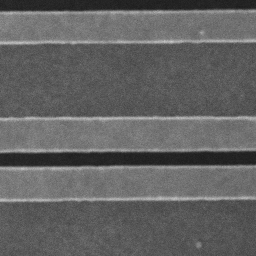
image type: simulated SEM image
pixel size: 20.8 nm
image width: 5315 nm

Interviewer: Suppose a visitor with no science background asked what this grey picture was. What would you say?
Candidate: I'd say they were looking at lines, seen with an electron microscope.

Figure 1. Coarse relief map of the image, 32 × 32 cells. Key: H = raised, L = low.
LLLLLLLLLLLLLLLLLLLLLLLLLLLLLLLL
HHHHHHHHHHHHHHHHHHHHHHHHHHHHHHHH
HHHHHHHHHHHHHHHHHHHHHHHHHHHHHHHH
HHHHHHHHHHHHHHHHHHHHHHHHHHHHHHHH
HHHHHHHHHHHHHHHHHHHHHHHHHHHHHHHH
LLLLLLLLLLLLLLLLLLLLLLLLLLLLLLLL
LLLLLLLLLLLLLLLLLLLLLLLLLLLLLLLL
LLLLLLLLLLLLLLLLLLLLLLLLLLLLLLLL
LLLLLLLLLLLLLLLLLLLLLLLLLLLLLLLL
LLLLLLLLLLLLLLLLLLLLLLLLLLLLLLLL
LLLLLLLLLLLLLLLLLLLLLLLLLLLLLLLL
LLLLLLLLLLLLLLLLLLLLLLLLLLLLLLLL
LLLLLLLLLLLLLLLLLLLLLLLLLLLLLLLL
LLLLLLLLLLLLLLLLLLLLLLLLLLLLLLLL
LLLLLLLLLLLLLLLLLLLLLLLLLLLLLLLL
HHHHHHHHHHHHHHHHHHHHHHHHHHHHHHHH
HHHHHHHHHHHHHHHHHHHHHHHHHHHHHHHH
HHHHHHHHHHHHHHHHHHHHHHHHHHHHHHHH
HHHHHHHHHHHHHHHHHHHHHHHHHHHHHHHH
LLLLLLLLLLLLLLLLLLLLLLLLLLLLLLLL
LLLLLLLLLLLLLLLLLLLLLLLLLLLLLLLL
HHHHHHHHHHHHHHHHHHHHHHHHHHHHHHHH
HHHHHHHHHHHHHHHHHHHHHHHHHHHHHHHH
HHHHHHHHHHHHHHHHHHHHHHHHHHHHHHHH
HHHHHHHHHHHHHHHHHHHHHHHHHHHHHHHH
LLLLLLLLLLLLLLLLLLLLLLLLLLLLLLLL
LLLLLLLLLLLLLLLLLLLLLLLLLLLLLLLL
LLLLLLLLLLLLLLLLLLLLLLLLLLLLLLLL
LLLLLLLLLLLLLLLLLLLLLLLLLLLLLLLL
LLLLLLLLLLLLLLLLLLLLLLLLLLLLLLLL
LLLLLLLLLLLLLLLLLLLLLLLLLLLLLLLL
LLLLLLLLLLLLLLLLLLLLLLLLLLLLLLLL